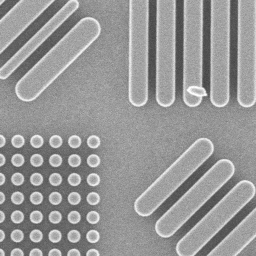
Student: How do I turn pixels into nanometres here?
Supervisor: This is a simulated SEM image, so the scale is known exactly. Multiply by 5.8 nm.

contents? groups of lines, slits or small figures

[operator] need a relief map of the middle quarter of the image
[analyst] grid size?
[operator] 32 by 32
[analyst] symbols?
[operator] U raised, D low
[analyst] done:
UDDDDDDDDDDDDDDDUUUUUDDUUUUUDDUU
DDDDDDDDDDDDDDDDUUUUUDDUUUUUDDUU
DDDDDDDDDDDDDDDDUUUUUDDUUUUUDDUU
DDDDDDDDDDDDDDDDUUUUUDDUUUUUDDUU
DDDDDDDDDDDDDDDDUUUUUDDUUUUUDDUU
DDDDDDDDDDDDDDDDUUUUUDDUUUUUDDUU
DDDDDDDDDDDDDDDDUUUUUDDUUUUUDDUU
DDDDDDDDDDDDDDDDUUUUUDDUUUUUDDUU
DDDDDDDDDDDDDDDDUUUUUDDUUUUUDDUU
DDDDDDDDDDDDDDDDDUUUUDDUUUUDDDUU
DDDDDDDDDDDDDDDDDDUDDDDDUUDDDDDU
DDDDDDDDDDDDDDDDDDDDDDDDDDDDDDDD
DDDDDDDDDDDDDDDDDDDDDDDDDDDDDDDD
DDDDDDDDDDDDDDDDDDDDDDDDDDDDDDDD
DDDDDDDDDDDDDDDDDDDDDDDDDDDDDDDD
DDDDDDDDDDDDDDDDDDDDDDDDDDDDDDDD
DDDDDDDDDDDDDDDDDDDDDDDDDDDDDDDD
DDDDDDDDDDDDDDDDDDDDDDDDDDDDDDDD
DUUUDDUUUDDDDDDDDDDDDDDDDDDDDDDD
DUUUDDUUUDDDDDDDDDDDDDDDDDDDDDDD
DDUUDDUUDDDDDDDDDDDDDDDDDDDDDDDD
DDDDDDDDDDDDDDDDDDDDDDDDDDDDDDDU
DDDDDDDDDDDDDDDDDDDDDDDDDDDDDDUU
DUUUDDUUUDDDDDDDDDDDDDDDDDDDDUUU
DUUUDDUUUDDDDDDDDDDDDDDDDDDDUUUU
DDUUDDUUDDDDDDDDDDDDDDDDDDDUUUUU
DDDDDDDDDDDDDDDDDDDDDDDDDDUUUUUU
DDDDDDDDDDDDDDDDDDDDDDDDDUUUUUUU
DUUUDDUUUDDDDDDDDDDDDDDUUUUUUUUD
DUUUDDUUUDDDDDDDDDDDDDUUUUUUUUDD
DDDDDDDDDDDDDDDDDDDDDUUUUUUUUDDD
DDDDDDDDDDDDDDDDDDDDDUUUUUUUDDDU